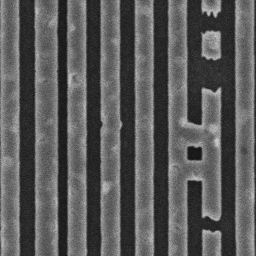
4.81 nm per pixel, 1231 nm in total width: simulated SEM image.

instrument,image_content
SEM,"parallel lines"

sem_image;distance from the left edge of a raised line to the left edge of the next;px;33.2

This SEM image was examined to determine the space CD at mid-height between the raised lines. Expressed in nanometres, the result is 73.3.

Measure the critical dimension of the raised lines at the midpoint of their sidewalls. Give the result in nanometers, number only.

92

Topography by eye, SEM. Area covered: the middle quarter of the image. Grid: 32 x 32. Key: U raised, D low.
DUUUUDDDDUUUUUDDDDUUUUDDDDUUUUUD
DUUUUDDDDUUUUUDDDDUUUUDDDDUUUUUD
DUUUUDDDDUUUUUDDDDUUUUDDDDUUUUUD
DUUUUDDDDUUUUUDDDDUUUUDDDDUUUUUD
DUUUUDDDDUUUUUDDDDUUUUDDDDUUUUUD
DUUUUDDDDUUUUUDDDDUUUUDDDDUUUUUD
DUUUUDDDDUUUUUDDDDUUUUDDDDUUUUUD
DUUUUDDDDUUUUUDDDDUUUUDDDDUUUUUD
DUUUUDDDDUUUUUDDDDUUUUDDDDUUUUUD
DUUUUDDDDUUUUUDDDDUUUUDDDDUUUUUD
DUUUUDDDDUUUUUDDDDUUUUDDDDUUUUUD
DUUUUDDDDUUUUUDDDDUUUUDDDDUUUUUD
DUUUUDDDDUUUUUDDDDUUUUDDDDUUUUUD
DUUUUDDDDUUUUUDDDDUUUUDDDDUUUUUD
DUUUUDDDDDUUUUDDDDUUUUDDDDUUUUUD
DUUUUDDDDDUUUUDDDDUUUUDDDDUUUUUU
DUUUUUDDDUUUUUDDDDUUUUDDDDUUUUUU
DUUUUDDDDUUUUUDDDDUUUUDDDDUUUUUU
DUUUUDDDDUUUUUDDDDUUUUDDDDUUUUUU
DUUUUDDDDUUUUUDDDDUUUUDDDDUUUUUU
DUUUUDDDDUUUUUDDDDUUUUDDDDUUUUUD
DUUUUDDDDUUUUUDDDDUUUUDDDDUUUUUD
DUUUUDDDDUUUUUDDDDUUUUDDDDUUUUUD
DUUUUDDDDUUUUUDDDDUUUUDDDDUUUUUD
DUUUUDDDDUUUUUDDDDUUUUDDDDUUUUUU
DUUUUDDDDUUUUUDDDDUUUUDDDDUUUUUU
DUUUUDDDDUUUUUDDDDUUUUDDDDUUUUUU
DUUUUDDDDUUUUUDDDDUUUUDDDDUUUUUU
DUUUUDDDDUUUUUDDDDUUUUDDDDUUUUUU
DUUUUDDDDUUUUUDDDDUUUUDDDDUUUUUD
DUUUUDDDDUUUUUDDDDUUUUDDDDUUUUUD
DUUUUDDDDUUUUUDDDDUUUUDDDDUUUUUD